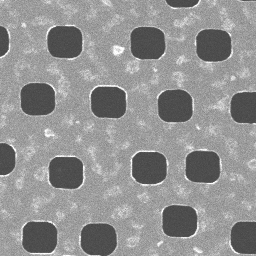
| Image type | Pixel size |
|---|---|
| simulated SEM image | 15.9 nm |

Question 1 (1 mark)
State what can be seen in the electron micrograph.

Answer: a regular array of holes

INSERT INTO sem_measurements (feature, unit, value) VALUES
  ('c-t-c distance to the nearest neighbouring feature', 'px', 66.1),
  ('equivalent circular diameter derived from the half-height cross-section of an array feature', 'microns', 0.572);